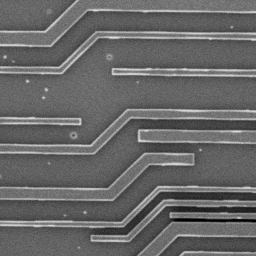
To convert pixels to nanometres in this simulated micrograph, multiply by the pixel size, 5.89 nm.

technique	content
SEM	groups of lines, slits or small figures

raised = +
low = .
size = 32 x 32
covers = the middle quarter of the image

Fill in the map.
+...............................
............++++++++++++++++++++
............++++++++++++++++++++
................................
................................
................................
................................
................................
................................
................................
................................
................+++++++++++++...
...............+++++++++++++++++
..............+++..+++++++++++++
++++.........+++................
...........+++..................
..........++++..................
..........+++......+++++++++++++
.........+++.......+++++++++++++
.......+++......................
++++++++++......................
+++++++++.......................
....................+++++.......
...................+++++++++++++
..................++++++++++++++
.................++++...........
................++++............
...............++++.............
..............++++..............
.............++++...............
............++++................
+++++++++++++++.......++++++++++